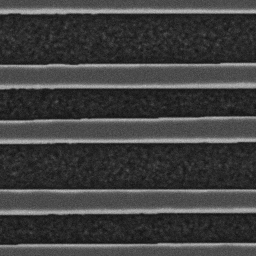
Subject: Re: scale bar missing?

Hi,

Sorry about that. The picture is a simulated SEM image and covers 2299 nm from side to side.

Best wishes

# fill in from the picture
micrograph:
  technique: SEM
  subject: lines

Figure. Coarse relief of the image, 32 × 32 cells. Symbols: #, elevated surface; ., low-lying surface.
################################
#.###..######.##.............###
................................
................................
................................
................................
................................
................................
################################
################################
################################
................................
................................
................................
................................
################################
################################
################################
................................
................................
................................
................................
................................
................................
################################
################################
########################........
................................
................................
................................
........................########
################################